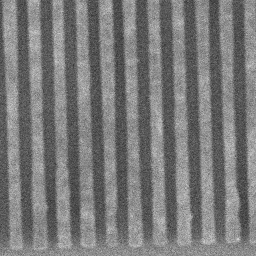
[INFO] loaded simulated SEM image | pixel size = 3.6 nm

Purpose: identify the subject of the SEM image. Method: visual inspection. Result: parallel lines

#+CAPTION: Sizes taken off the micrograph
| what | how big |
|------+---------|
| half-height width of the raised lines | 43.7 nanometers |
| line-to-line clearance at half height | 43.7 nm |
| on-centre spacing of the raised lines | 24.1 pixels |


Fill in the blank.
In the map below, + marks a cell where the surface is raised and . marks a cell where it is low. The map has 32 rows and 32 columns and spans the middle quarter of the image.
...+++...++++..+++...+++...+++..
...+++...++++..+++...+++...+++..
...+++...++++..+++...+++....++..
...++++...+++..+++...+++....++..
....++....+++..+++...+++....++..
....++....++...+++....++....++..
....++....++...+++....++....++..
....++....++....++....++....++..
....++....++....++....++....++..
....++....+++...++....++....+++.
....++....+++...++....++....+++.
....+++...+++...++....++....+++.
....+++...+++...++....+++...+++.
....+++...+++...++....+++...+++.
+...+++...+++...++....+++...+++.
+...+++...+++...++....+++...+++.
+...+++...+++...++....+++...+++.
+...+++...+++...++....+++...+++.
+...+++...+++...++....+++...+++.
+...+++...+++...+++...+++...+++.
+...+++...+++...+++...+++...+++.
+...+++...+++...+++...+++...+++.
+...+++...+++...+++...+++...+++.
+...+++...+++...+++...+++...+++.
+...+++...+++...+++...+++...+++.
+...+++...+++...+++...+++...+++.
+...+++...+++...+++...+++...+++.
+...+++...+++...+++...+++...+++.
+...+++...+++...+++...+++...+++.
+...+++...+++...+++...+++...+++.
+...+++...+++...+++...+++...+++.
+...+++...+++...+++...+++...+++.